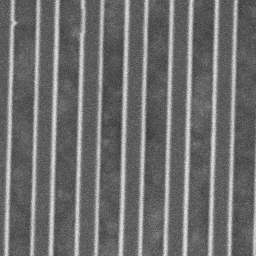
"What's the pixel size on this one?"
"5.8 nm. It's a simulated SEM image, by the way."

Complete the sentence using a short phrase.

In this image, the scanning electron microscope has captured parallel lines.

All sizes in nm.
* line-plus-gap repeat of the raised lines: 259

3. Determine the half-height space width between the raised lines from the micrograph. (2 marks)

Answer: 25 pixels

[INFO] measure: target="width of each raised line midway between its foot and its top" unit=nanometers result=117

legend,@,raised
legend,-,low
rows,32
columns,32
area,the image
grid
@@---@@---@@@---@@---@@@---@@---
@@---@@---@@@---@@---@@@---@@---
@@---@@---@@@---@@---@@@---@@---
@@---@@---@@@---@@---@@@---@@---
@@---@@---@@@---@@---@@@---@@---
@@---@@---@@@---@@---@@@---@@---
@----@@---@@@---@@---@@@---@@---
@----@@---@@@---@@---@@@---@@---
@----@@---@@@---@@---@@@---@@---
@----@@---@@@---@@---@@@---@@---
@----@@---@@@---@@---@@@---@@---
@----@@---@@@---@@---@@@---@@---
@----@@---@@@---@@---@@@---@@---
@----@@---@@----@@---@@@---@@---
@----@@---@@----@@---@@@---@@---
@---@@@---@@----@@---@@@---@@---
@---@@@---@@----@@---@@----@@---
@---@@@---@@---@@@---@@----@@---
@---@@@---@@---@@@---@@----@@---
@---@@@---@@---@@@---@@----@@---
@---@@@---@@---@@@---@@----@@---
@---@@@---@@---@@@---@@----@@---
@---@@@---@@---@@@---@@----@@---
@---@@@---@@---@@@---@@----@@---
@---@@@---@@---@@@---@@----@@---
@---@@@---@@---@@@---@@---@@@---
@---@@----@@---@@@---@@---@@@---
@---@@----@@---@@@---@@---@@@---
@---@@----@@---@@@---@@---@@@---
@---@@----@@---@@@---@@---@@@---
@---@@----@@---@@@---@@---@@@---
@---@@----@@---@@@---@@---@@@---